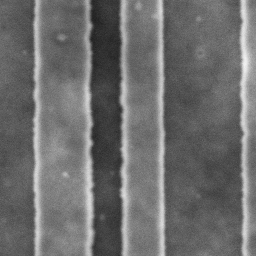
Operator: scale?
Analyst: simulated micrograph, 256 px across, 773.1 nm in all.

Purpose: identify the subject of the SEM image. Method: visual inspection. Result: lines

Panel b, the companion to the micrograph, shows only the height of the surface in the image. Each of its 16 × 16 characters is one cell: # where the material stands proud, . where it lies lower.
..####..##.....#
..####..##.....#
..####..##.....#
..####..##.....#
..####..##.....#
..####..##.....#
..####..##.....#
..####..##.....#
..####..##.....#
..####..##.....#
..####..##.....#
..####..##.....#
..####..##.....#
..####..##.....#
..####..##.....#
..####..##.....#